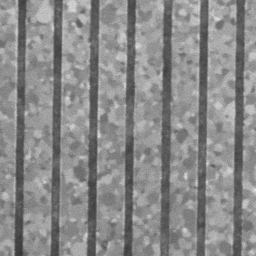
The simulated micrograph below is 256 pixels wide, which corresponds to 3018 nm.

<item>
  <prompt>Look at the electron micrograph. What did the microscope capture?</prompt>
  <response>parallel lines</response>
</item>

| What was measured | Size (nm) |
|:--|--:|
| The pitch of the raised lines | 429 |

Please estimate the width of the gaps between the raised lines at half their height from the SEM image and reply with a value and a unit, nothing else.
112 nanometers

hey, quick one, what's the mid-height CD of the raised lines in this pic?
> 0.315 micrometres